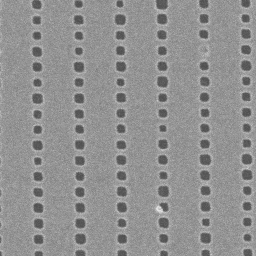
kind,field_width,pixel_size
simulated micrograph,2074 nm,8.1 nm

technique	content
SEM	a regular array of holes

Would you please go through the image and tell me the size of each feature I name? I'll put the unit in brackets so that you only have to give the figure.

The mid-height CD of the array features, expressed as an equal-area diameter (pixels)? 10.3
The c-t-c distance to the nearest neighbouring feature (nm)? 125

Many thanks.